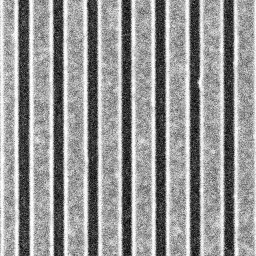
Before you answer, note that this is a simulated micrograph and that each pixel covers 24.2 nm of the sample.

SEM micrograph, parallel lines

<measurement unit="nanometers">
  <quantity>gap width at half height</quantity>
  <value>314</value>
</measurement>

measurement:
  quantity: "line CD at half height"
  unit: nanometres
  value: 532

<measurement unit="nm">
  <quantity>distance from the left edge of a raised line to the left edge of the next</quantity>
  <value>817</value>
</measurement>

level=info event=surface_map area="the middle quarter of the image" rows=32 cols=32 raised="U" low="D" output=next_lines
UUUUUDDDDUUUUUDDDUUUUUDDDDUUUUUD
UUUUUDDDDUUUUUDDDUUUUUDDDDUUUUUD
UUUUUDDDDUUUUUDDDUUUUUDDDDUUUUUD
UUUUUDDDDUUUUUDDDUUUUUDDDDUUUUUD
UUUUUDDDDUUUUUDDDUUUUUDDDDUUUUUD
UUUUUDDDDUUUUUDDDUUUUUDDDDUUUUUD
UUUUUDDDDUUUUUDDDUUUUUDDDDUUUUUD
UUUUUDDDDUUUUUDDDUUUUUDDDDUUUUUD
UUUUUDDDDUUUUUDDDUUUUUDDDDUUUUUD
UUUUUDDDDUUUUUDDDUUUUUDDDDUUUUUD
UUUUUDDDDUUUUUDDDUUUUUDDDDUUUUUD
UUUUUDDDDUUUUUDDDUUUUUDDDDUUUUUD
UUUUUDDDDUUUUUDDDUUUUUDDDDUUUUUD
UUUUUDDDDUUUUUDDDUUUUUDDDDUUUUUD
UUUUUDDDDUUUUUDDDUUUUUDDDDUUUUUD
UUUUUDDDDUUUUUDDDUUUUUDDDDUUUUUD
UUUUUDDDDUUUUUDDDUUUUUDDDDUUUUUD
UUUUUDDDDUUUUUDDDUUUUUDDDDUUUUUD
UUUUUDDDDUUUUUDDDUUUUUDDDDUUUUUD
UUUUUDDDDUUUUUDDDUUUUUDDDDUUUUUD
UUUUUDDDDUUUUUDDDUUUUUDDDDUUUUUD
UUUUUDDDDUUUUUDDDUUUUUDDDDUUUUUD
UUUUUDDDDUUUUUDDDUUUUUDDDDUUUUUD
UUUUUUDDDUUUUUDDDUUUUUUDDDUUUUUD
UUUUUUDDDUUUUUDDDUUUUUUDDDUUUUUD
UUUUUUDDDUUUUUDDDUUUUUUDDDUUUUUD
UUUUUUDDDUUUUUDDDUUUUUUDDDUUUUUD
UUUUUUDDDUUUUUDDDUUUUUUDDDUUUUUD
UUUUUUDDDUUUUUDDDUUUUUUDDDUUUUUD
UUUUUUDDDUUUUUDDDUUUUUUDDDUUUUUD
UUUUUUDDDUUUUUDDDUUUUUUDDDUUUUUD
UUUUUUDDDUUUUUDDDUUUUUUDDDUUUUUD